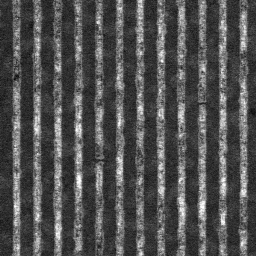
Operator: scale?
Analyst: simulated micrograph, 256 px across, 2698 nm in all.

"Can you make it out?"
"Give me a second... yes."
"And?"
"parallel lines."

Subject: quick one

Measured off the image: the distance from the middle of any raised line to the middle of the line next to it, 218 nm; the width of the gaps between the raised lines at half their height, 0.0646 microns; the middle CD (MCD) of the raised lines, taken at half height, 153 nanometers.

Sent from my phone